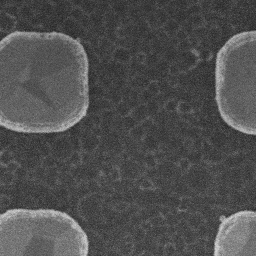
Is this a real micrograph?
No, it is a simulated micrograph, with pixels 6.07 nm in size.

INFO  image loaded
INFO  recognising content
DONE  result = raised bodies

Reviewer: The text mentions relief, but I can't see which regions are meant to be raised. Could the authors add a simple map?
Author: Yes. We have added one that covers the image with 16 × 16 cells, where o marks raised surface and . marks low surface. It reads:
................
................
ooooo.........oo
ooooo.........oo
ooooo.........oo
ooooo.........oo
ooooo.........oo
ooooo.........oo
................
................
................
................
................
oooo...........o
ooooo.........oo
ooooo........ooo